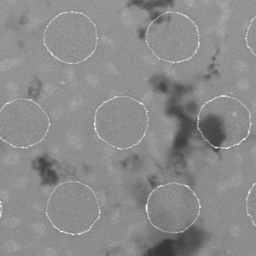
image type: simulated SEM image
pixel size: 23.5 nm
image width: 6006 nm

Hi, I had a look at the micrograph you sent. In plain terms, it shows raised bodies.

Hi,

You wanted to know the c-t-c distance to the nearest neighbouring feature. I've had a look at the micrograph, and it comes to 2320 nm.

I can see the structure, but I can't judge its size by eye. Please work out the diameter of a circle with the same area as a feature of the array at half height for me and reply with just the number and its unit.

1230 nanometers